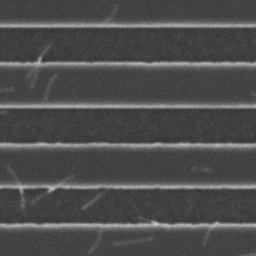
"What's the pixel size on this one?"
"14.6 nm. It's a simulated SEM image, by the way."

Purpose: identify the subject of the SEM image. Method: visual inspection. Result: lines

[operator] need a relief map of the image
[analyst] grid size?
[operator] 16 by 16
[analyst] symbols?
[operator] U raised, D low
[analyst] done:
UUUUUUUUUUUUUUUU
UUUUUUUUUUUUUUUU
DDDDDDDDDDDDDDDD
DDDDDDDDDDDDDDDD
UUUUUUUUUUUUUUUU
UUUUUUUUUUUUUUUU
UUUUUUUUUUUUUUUU
DDDDDDDDDDDDDDDD
DDDDDDDDDDDDDDDD
UUUUUUUUUUUUUUUU
UUUUUUUUUUUUUUUU
UUUUUUUUUUUUUUUU
DDDDDDDDDDDDDDDD
DDDDDDDDDDDDDDDD
UUUUUUUUUUUUUUUU
UUUUUUUUUUUUUUUU